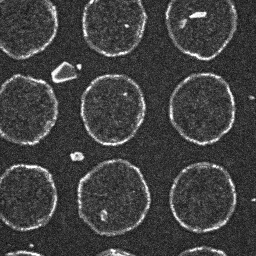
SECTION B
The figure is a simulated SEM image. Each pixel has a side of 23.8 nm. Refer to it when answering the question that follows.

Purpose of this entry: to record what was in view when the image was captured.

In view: raised bodies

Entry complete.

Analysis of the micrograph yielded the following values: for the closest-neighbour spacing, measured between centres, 2110 nanometers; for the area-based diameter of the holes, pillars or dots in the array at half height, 1580 nm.